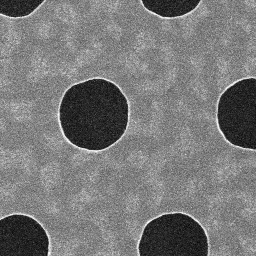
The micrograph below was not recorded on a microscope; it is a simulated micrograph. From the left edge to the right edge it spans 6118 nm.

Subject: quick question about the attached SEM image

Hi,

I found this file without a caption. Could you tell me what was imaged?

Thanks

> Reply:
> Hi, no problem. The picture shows holes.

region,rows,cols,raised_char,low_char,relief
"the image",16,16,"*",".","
..*******...****
****************
****************
****************
****************
****...*******..
****....******..
****....******..
****....******..
****************
****************
****************
****************
*.********..****
...******....***
...******....***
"